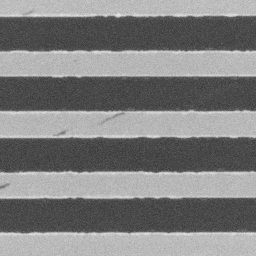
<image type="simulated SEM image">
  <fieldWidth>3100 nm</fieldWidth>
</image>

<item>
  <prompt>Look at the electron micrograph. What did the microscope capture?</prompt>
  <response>lines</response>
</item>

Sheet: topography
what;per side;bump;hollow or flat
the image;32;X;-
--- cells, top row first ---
XXXXXXXXXXXXXXXXXXXXXXXXXXXXXXXX
XXXXXXXXXXXXXXXXXXXXXXXXXXXXXXXX
--------------------------------
--------------------------------
--------------------------------
--------------------------------
-XXX--XXXXXXXX-XXXXXXXXXXXXXXX-X
XXXXXXXXXXXXXXXXXXXXXXXXXXXXXXXX
XXXXXXXXXXXXXXXXXXXXXXXXXXXXXXXX
--------------------------------
--------------------------------
--------------------------------
--------------------------------
--------------------------------
XXXXXXXXXXXXXXXXXXXXXXXXXXXXXXXX
XXXXXXXXXXXXXXXXXXXXXXXXXXXXXXXX
XXXXXXXXXXXXXXXXXXXXXXXXXXXXXXXX
--------------------------------
--------------------------------
--------------------------------
--------------------------------
--------X--------X--------------
XXXXXXXXXXXXXXXXXXXXXXXXXXXXXXXX
XXXXXXXXXXXXXXXXXXXXXXXXXXXXXXXX
XXXXXXXXXXXXXXXXXXXXXXXXXXXXXXXX
--------------------------------
--------------------------------
--------------------------------
--------------------------------
XXXXXXXXXXXXXXXXXXXXXXXXXXXXXXXX
XXXXXXXXXXXXXXXXXXXXXXXXXXXXXXXX
XXXXXXXXXXXXXXXXXXXXXXXXXXXXXXXX